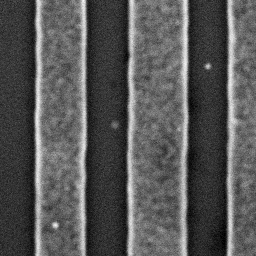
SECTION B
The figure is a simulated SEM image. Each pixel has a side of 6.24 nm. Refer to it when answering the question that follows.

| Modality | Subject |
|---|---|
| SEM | wiring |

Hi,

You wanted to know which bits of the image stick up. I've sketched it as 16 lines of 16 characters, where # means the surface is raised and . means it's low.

..###...####..##
..###...####..##
..###...####..##
..###...####..##
..###...####..##
..###...####..##
..###...####..##
..###...####..##
..###...####..##
..###...####..##
..###...####..##
..###...####..##
..###...####..##
..###...####..##
..###...####..##
..###...####..##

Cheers